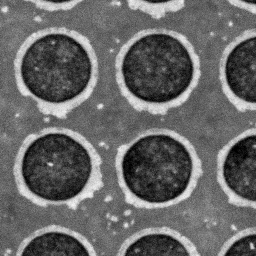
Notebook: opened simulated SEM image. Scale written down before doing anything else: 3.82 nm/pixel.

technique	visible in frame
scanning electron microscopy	holes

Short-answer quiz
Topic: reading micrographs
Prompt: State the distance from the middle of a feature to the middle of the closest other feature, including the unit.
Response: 380 nanometres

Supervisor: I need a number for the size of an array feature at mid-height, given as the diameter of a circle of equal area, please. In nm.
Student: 273